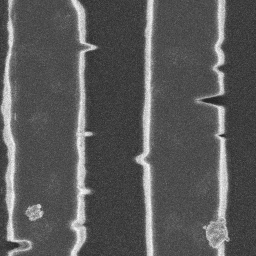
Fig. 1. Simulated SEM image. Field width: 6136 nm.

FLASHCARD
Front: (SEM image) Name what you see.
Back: one or a few lines or trenches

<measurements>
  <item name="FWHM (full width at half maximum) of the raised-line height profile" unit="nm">1760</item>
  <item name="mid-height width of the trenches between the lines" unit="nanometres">1570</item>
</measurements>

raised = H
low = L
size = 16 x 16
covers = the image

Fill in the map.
LHHHHLLLLHHHHHLL
LHHHHLLLLHHHHHLL
LHHHHLLLLHHHHHLL
LHHHHLLLLHHHHHLL
HHHHHLLLLHHHHHLL
HHHHHLLLLHHHHHLL
HHHHHLLLLHHHHLLL
HHHHHLLLLHHHHHLL
LHHHHLLLLHHHHHLL
LHHHHLLLLHHHHHLL
LHHHHLLLLHHHHHLL
LHHHHLLLLHHHHHLL
LHHHHLLLLHHHHHLL
LHHHHLLLLHHHHHLL
LHHHHLLLLHHHHHLL
LHHHHLLLLHHHHHLL